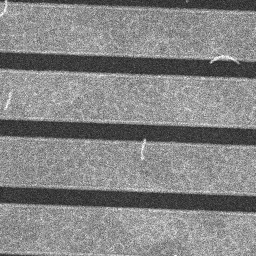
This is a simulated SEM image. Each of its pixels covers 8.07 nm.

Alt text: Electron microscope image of one or a few lines or trenches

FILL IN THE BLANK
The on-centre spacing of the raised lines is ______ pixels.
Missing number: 67.1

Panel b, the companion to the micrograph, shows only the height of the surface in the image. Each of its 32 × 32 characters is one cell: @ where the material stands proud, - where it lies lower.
@@@-----------------------------
@@@@@@@@@@@@@@@@@@@@@@@@@@@@-@--
@@@@@@@@@@@@@@@@@@@@@@@@@@@@@@@@
@@@@@@@@@@@@@@@@@@@@@@@@@@@@@@@@
@@@@@@@@@@@@@@@@@@@@@@@@@@@@@@@@
@@@@@@@@@@@@@@@@@@@@@@@@@@@@@@@@
-----@@@@@@@@@@@@@@@@@@@@@@@@@@@
--------------------------@--@-@
--------------------------------
@@@@@@@@@@@@@@@@@@@-------------
@@@@@@@@@@@@@@@@@@@@@@@@@@@@@@@@
@@@@@@@@@@@@@@@@@@@@@@@@@@@@@@@@
@@@@@@@@@@@@@@@@@@@@@@@@@@@@@@@@
@@@@@@@@@@@@@@@@@@@@@@@@@@@@@@@@
@@@@@@@@@@@@@@@@@@@@@@@@@@@@@@@@
----------------------@@@@@@@@@@
--------------------------------
@@@@@@@@@-----------------------
@@@@@@@@@@@@@@@@@@@@@@@@@@@@@@@@
@@@@@@@@@@@@@@@@@@@@@@@@@@@@@@@@
@@@@@@@@@@@@@@@@@@@@@@@@@@@@@@@@
@@@@@@@@@@@@@@@@@@@@@@@@@@@@@@@@
@@@@@@@@@@@@@@@@@@@@@@@@@@@@@@@@
----------@@@@@@@@@@@@@@@@@@@@@@
--------------------------------
--------------------------------
@@@@@@@@@@@@@@@@@@@@@@@@@@------
@@@@@@@@@@@@@@@@@@@@@@@@@@@@@@@@
@@@@@@@@@@@@@@@@@@@@@@@@@@@@@@@@
@@@@@@@@@@@@@@@@@@@@@@@@@@@@@@@@
@@@@@@@@@@@@@@@@@@@@@@@@@@@@@@@@
@@@@@@@@@@@@@@@@@@@@@@@@@@@@@@@@